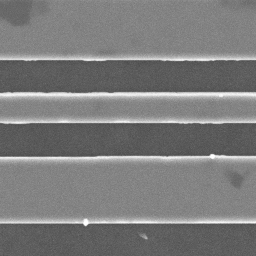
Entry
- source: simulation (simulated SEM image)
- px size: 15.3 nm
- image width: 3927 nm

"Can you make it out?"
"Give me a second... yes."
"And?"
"lines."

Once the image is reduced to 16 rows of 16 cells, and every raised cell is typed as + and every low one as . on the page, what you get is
++++++++++++++++
++++++++++++++++
++++++++++++++++
++++++++++++++++
................
................
++++++++++++++++
++++++++++++++++
................
................
++++++++++++++++
++++++++++++++++
++++++++++++++++
++++++++++++++++
................
................